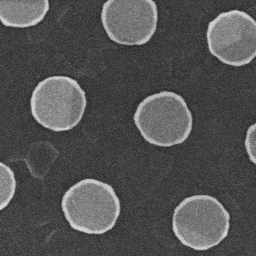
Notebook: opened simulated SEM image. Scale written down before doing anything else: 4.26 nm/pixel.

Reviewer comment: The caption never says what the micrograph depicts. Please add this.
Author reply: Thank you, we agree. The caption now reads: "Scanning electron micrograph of raised bodies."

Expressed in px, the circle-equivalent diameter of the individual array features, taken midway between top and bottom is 53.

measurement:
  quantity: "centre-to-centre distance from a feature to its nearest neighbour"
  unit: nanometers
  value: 459